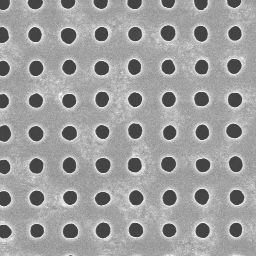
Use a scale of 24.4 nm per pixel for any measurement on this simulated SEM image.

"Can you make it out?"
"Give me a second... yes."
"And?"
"a regular array of holes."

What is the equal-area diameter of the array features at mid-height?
362 nanometers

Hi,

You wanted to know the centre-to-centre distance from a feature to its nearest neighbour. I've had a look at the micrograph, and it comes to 785 nm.